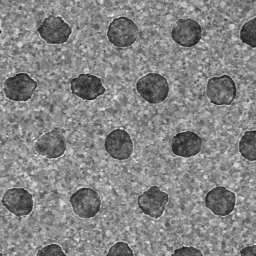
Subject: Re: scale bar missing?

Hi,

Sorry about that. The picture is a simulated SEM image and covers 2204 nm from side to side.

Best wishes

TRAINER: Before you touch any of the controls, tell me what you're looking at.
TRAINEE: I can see a regular array of holes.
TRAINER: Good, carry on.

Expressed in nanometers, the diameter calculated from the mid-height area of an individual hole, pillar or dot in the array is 256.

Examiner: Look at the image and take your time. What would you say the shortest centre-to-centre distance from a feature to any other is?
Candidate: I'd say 563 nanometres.